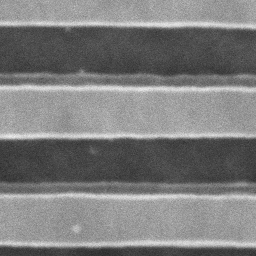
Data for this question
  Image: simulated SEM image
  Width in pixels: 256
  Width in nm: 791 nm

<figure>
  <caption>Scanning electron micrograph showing lines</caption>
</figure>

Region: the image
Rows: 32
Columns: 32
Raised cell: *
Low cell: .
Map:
********************************
********************************
********************************
.............................***
................................
................................
................................
................................
................................
................................
................................
********************************
********************************
********************************
********************************
********************************
********************************
................................
................................
................................
................................
................................
................................
................................
********************************
********************************
********************************
********************************
********************************
********************************
********************************
................................